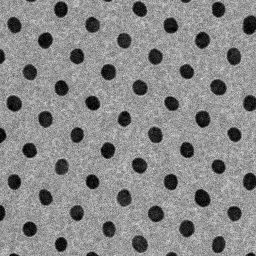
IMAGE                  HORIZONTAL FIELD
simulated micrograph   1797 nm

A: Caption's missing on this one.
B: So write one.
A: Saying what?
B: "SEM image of a regular array of holes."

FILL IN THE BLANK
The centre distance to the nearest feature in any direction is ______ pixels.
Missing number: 34.7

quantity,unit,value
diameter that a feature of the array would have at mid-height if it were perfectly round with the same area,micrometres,0.109